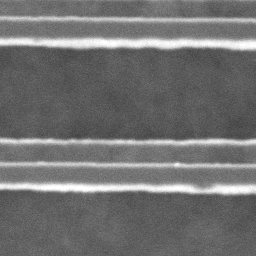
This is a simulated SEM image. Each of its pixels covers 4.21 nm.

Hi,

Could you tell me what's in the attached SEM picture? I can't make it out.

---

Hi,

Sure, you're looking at lines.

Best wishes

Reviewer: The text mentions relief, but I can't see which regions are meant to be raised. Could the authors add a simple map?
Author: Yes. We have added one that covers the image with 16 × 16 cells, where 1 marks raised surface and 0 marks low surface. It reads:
1111111111111111
1111111111111111
1111111111111111
0000000000000000
0000000000000000
0000000000000000
0000000000000000
0000000000000000
0000000000000000
1111111111111111
1111111111111111
1111111111111111
0000000000000000
0000000000000000
0000000000000000
0000000000000000